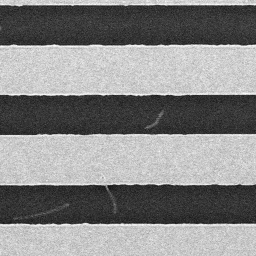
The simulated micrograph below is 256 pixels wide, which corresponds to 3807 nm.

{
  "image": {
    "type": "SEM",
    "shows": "lines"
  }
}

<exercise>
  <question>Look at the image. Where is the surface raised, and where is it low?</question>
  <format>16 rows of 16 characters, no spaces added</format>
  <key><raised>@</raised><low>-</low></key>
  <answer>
----------------
----------------
----------------
@@@@@@@@@@@@@@@@
@@@@@@@@@@@@@@@@
@@@@@@@@@@@@@@@@
----------------
----------------
@@@@@@@@@@@@@@@@
@@@@@@@@@@@@@@@@
@@@@@@@@@@@@@@@@
@@@@@@@@@@@@@@@@
----------------
----------------
@@@@@@@@@@@@@@@@
@@@@@@@@@@@@@@@@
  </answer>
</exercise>